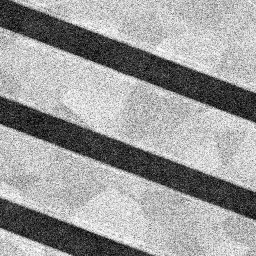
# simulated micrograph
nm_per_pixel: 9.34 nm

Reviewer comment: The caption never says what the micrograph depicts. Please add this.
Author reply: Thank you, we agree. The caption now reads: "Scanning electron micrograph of one or a few lines or trenches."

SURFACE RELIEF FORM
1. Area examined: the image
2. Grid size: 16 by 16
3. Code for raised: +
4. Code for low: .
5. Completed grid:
..++++++++++++++
.....+++++++++++
++.....+++++++++
+++++.....++++++
+++++++......+++
++++++++++.....+
..++++++++++....
....+++++++++++.
++.....+++++++++
++++......++++++
+++++++.....++++
++++++++++.....+
.+++++++++++....
...++++++++++++.
......++++++++++
+++......+++++++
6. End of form